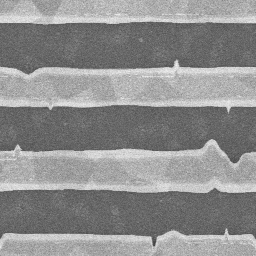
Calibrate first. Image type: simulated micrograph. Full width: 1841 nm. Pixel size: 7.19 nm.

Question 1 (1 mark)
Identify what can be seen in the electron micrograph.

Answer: one or a few lines or trenches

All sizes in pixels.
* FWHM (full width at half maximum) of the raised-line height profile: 34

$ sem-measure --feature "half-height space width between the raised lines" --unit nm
357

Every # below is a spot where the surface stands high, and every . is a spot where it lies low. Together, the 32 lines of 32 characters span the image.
################################
################################
............####..#############.
................................
................................
................................
................................
................................
................................
###.############################
################################
################################
################################
................................
................................
................................
................................
................................
..........................#.....
############################..##
################################
################################
################################
..............#####.....##..###.
................................
................................
................................
................................
................................
.....................##.....#...
################################
################################